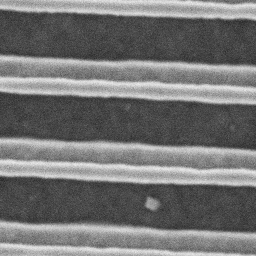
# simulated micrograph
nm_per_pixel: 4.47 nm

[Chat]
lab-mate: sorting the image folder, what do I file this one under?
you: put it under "lines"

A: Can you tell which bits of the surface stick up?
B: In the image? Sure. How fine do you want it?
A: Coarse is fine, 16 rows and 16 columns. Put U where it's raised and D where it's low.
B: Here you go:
UUUUUUUUUUUUUUUU
DDDDDDDDDDDDDDDD
DDDDDDDDDDDDDDDD
DDDDDDDDDDDDDDDD
UUUUUUUUUUUUUUUU
UUUUUUUUUUUUUUUU
DDDDDDDDDDDDDDDD
DDDDDDDDDDDDDDDD
DDDDDDDDDDDDDDDD
UUUUUUUUUUUUUUUU
UUUUUUUUUUUUUUUU
DDDDDDDDDDDDDUUU
DDDDDDDDDDDDDDDD
DDDDDDDDDDDDDDDD
UUUUUUUUUUUUUDDD
UUUUUUUUUUUUUUUU